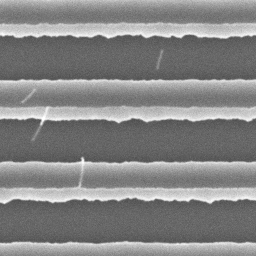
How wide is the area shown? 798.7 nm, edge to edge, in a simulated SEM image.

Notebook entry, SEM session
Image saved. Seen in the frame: lines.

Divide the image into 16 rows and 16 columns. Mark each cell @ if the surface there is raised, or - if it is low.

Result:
@@@@@@@@@@@@@@@@
@@@@@@@@@@@@@@@@
----------------
----------------
----------------
@@@@@@@@@@@@@@@@
@@@@@@@@@@@@@@@@
---@@--@-@--@---
----------------
----------------
@@@@@@@@@@@@@@@@
@@@@@@@@@@@@@@@@
@-@@------@@@@--
----------------
----------------
@@@@@@@@@@@@@@@@